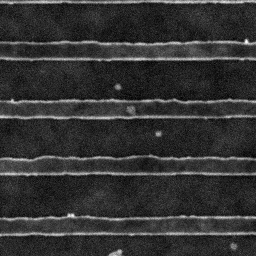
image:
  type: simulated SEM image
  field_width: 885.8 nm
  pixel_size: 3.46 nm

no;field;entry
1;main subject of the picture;lines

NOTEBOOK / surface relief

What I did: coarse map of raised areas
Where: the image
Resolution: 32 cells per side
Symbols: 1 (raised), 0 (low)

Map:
00000000000000000000000000000000
00000000000000000000000000000000
00000000000000000000000000000000
00000000000000000000000000000000
00000000000000000000000000000000
11111111111111110101111111111111
11111111111111111111111111111111
00000000000000000000000000000000
00000000000000000000000000000000
00000000000000000000000000000000
00000000000000000000000000000000
00000000000000000000000000000000
00000000000000000000000000001000
11111111111111111111111111111111
11111111111111111111111111111111
00000000000000000000000000000000
00000000000000000000000000000000
00000000000000000000000000000000
00000000000000000000000000000000
00000000000000000000000000000000
11111111111111111111111111111111
11111111111111111111111111111111
00000000000000000000000000000000
00000000000000000000000000000000
00000000000000000000000000000000
00000000000000000000000000000000
00000000000000000000000000000000
11111111111111111111111111111111
11111111111111111111111111111111
00000000000000000000000000000000
00000000000000000000000000000000
00000000000000000000000000000000